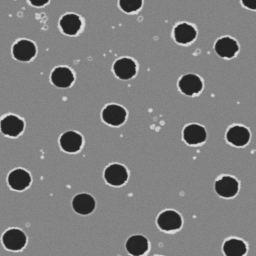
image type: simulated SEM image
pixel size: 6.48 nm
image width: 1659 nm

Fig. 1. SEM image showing a regular array of holes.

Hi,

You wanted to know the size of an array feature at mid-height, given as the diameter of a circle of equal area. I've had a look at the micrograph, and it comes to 21.3 pixels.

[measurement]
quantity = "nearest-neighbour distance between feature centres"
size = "310 nanometers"